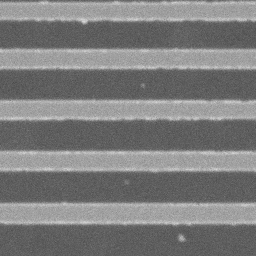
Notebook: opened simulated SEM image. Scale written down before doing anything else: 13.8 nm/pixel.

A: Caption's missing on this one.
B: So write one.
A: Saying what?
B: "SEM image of lines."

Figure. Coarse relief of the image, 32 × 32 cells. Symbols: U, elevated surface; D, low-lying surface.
UUUUUUUUUUUUUUUUUUUUUUUUUUUUUUUU
UUUUUUUUUUUUUUUUUUUUUUUUUUUUUUUU
DDDDDDUUUUUUDDUUUUUDUUUDDUUUDUUU
DDDDDDDDDDDDDDDDDDDDDDDDDDDDDDDD
DDDDDDDDDDDDDDDDDDDDDDDDDDDDDDDD
DDDDDDDDDDDDDDDDDDDDDDDDDDDDDDDD
UUUUUUUUUUUUUUUUUUUUUUUUUUUUUUUU
UUUUUUUUUUUUUUUUUUUUUUUUUUUUUUUU
UUUUUUUUUUUUUUUUUUUUUUUUDUUUUUUU
DDDDDDDDDDDDDDDDDDDDDDDDDDDDDDDD
DDDDDDDDDDDDDDDDDDDDDDDDDDDDDDDD
DDDDDDDDDDDDDDDDDDDDDDDDDDDDDDDD
DDDDDDDDDDDDDDDDDDDDDDDDDDDDDDDD
UUUUUUUUUUUUUUUUUUUUUUUUUUUUUUUU
UUUUUUUUUUUUUUUUUUUUUUUUUUUUUUUU
DDDDDDDDDDDDDDDDDDDDDDDDDDDDDDDD
DDDDDDDDDDDDDDDDDDDDDDDDDDDDDDDD
DDDDDDDDDDDDDDDDDDDDDDDDDDDDDDDD
DDDDDDDDDDDDDDDDDDDDDDDDDDDDDDDD
UUUUUUUUUUUUUUUUUUUUUUUUUUUUUUUU
UUUUUUUUUUUUUUUUUUUUUUUUUUUUUUUU
DDDDDDDDDDDDDDDDDDDDDDDDDDDDDDDD
DDDDDDDDDDDDDDDDDDDDDDDDDDDDDDDD
DDDDDDDDDDDDDDDDDDDDDDDDDDDDDDDD
DDDDDDDDDDDDDDDDDDDDDDDDDDDDDDDD
DDDDDDDDUDDDDDDDDDDDDDDDDDDDDDDD
UUUUUUUUUUUUUUUUUUUUUUUUUUUUUUUU
UUUUUUUUUUUUUUUUUUUUUUUUUUUUUUUU
DDDDDDDDDDDDDDDDDDDDDDDDDDDDDDDD
DDDDDDDDDDDDDDDDDDDDDDDDDDDDDDDD
DDDDDDDDDDDDDDDDDDDDDDDDDDDDDDDD
DDDDDDDDDDDDDDDDDDDDDDDDDDDDDDDD